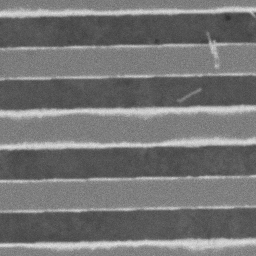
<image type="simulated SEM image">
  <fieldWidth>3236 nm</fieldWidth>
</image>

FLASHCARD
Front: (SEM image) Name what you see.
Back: lines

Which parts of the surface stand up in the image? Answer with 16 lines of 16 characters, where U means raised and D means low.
UUUUUUUUUUUUUUUU
DDDDDDDDDDDDDDDD
DDDDDDDDDDDDDDDD
UUUUUUUUUUUUUUUU
UUUUUUUUUUUUUUUU
DDDDDDDDDDDDDDDD
DDDDDDDDDDDDDDDD
UUUUUUUUUUUUUUUU
UUUUUUUUUUUUUUUU
DDDDDDDDDDDDDDDD
DDDDDDDDDDDDDDDD
UUUUUUUUUUUUUUUU
UUUUUUUUUUUUUUUU
DDDDDDDDDDDDDDDD
DDDDDDDDDDDDDDDD
UUUUUUUUUUUUUUUU